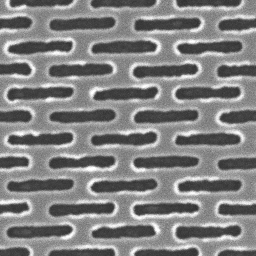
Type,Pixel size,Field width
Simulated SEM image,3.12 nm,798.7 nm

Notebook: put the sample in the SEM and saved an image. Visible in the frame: a regular array of holes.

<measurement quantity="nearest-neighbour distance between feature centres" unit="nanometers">143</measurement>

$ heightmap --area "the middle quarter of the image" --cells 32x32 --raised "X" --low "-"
------------XXXXXX--------------
------------XXXXX---------------
-----------XXXXXX---------------
XXXXXXXXXXXXXXXXXX--XXXXXXXXXXXX
XXXXXXXXXXXXXXXXXXXXXXXXXXXXXXXX
XXXXXXXXXXXXXXXXXXXXXXXXXXXXXXXX
--XXXXXXXX--------------XXXX----
--XXXXXX---------------XXXXX----
-XXXXXX----------------XXXXX----
XXXXXXXXXXXXXXXXXXXXXXXXXXXXXXXX
XXXXXXXXXXXXXXXXXXXXXXXXXXXXXXXX
XXXXXXXX----XXXXXXXXXXXXXXX-XX--
-------------XXXXX--------------
-------------XXXX---------------
------XXXXXXXXXXXX-----------XXX
XXXXXXXXXXXXXXXXXXXXXXXXXXXXXXXX
XXXXXXXXXXXXXXXXXXXXXXXXXXXXXXXX
--XXXXXXXX-----X-------XXXXXXXXX
--XXXXX----------------XXXXX----
--XXXXX----------------XXXXX----
XXXXXXXX-XXXXXXXXXXXXXXXXXXXXXXX
XXXXXXXXXXXXXXXXXXXXXXXXXXXXXXXX
XXXXXXXXXXXXXXXXXXXXXXXXXXXXXXXX
--XX---------XXXXX--------------
-------------XXXX---------------
------------XXXXXX--------------
XXXXXXXXXXXXXXXXXXXXXXXXXXXXXXXX
XXXXXXXXXXXXXXXXXXXXXXXXXXXXXXXX
XXXXXXXXXXXXXXXXXXXXXXXXXXXXXXXX
--XXXXXX---------------XXXXXXX--
--XXXXX----------------XXXXX----
-XXXXXX---------------XXXXXXX---